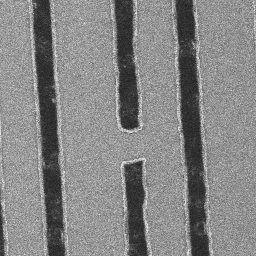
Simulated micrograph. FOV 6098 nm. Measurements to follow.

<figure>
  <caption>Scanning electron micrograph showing one or a few lines or trenches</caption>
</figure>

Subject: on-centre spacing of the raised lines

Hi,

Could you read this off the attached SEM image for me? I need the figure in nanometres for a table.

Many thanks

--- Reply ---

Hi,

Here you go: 1700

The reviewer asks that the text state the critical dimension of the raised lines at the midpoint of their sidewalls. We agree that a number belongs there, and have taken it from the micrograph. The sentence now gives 523 nm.